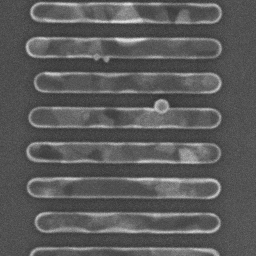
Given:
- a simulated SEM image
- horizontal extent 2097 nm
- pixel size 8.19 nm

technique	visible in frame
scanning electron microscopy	groups of lines, slits or small figures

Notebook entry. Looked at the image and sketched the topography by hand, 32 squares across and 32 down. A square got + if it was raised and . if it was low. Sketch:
.....+++...++++.++++++++........
....++++++++++++++++++++++++....
.....++++++++++++++++++++++.....
................................
................................
...++++++++++++++++++++++++.....
....++++++++++++++++++++++++....
................................
................................
.....++++++++++++++++++++++.....
....++++++++++++++++++++++++....
..................++++.+++......
................................
...................+++..........
....++++++++++++++++++++++++....
....+++++++++++++++++++++++.....
................................
................................
....+++++++++++++++++++++++.....
....++++++++++++++++++++++++....
................................
................................
....+++++++++++++++++...........
....+++++++++++++++++++++++.....
....+++++++++++++++++++++++.....
................................
................................
.....++++++++++++++++++++++.....
.....++++++++++++++++++++++.....
................................
................................
....+++++++++++++++++++++++.....